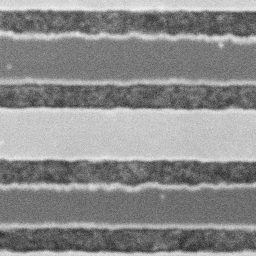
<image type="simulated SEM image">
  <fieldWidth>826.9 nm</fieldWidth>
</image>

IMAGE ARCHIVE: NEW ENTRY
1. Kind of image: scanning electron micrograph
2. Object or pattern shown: lines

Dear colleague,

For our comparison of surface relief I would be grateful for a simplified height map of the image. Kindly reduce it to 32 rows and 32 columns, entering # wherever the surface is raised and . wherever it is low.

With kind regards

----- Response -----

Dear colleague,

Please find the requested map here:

################################
................................
................................
................................
#####################.##....#...
################################
################################
################################
################################
################################
...............#...........##...
................................
................................
.....#.............#............
################################
################################
################################
################################
################################
################################
................................
................................
................................
################################
################################
################################
################################
################################
................................
................................
................................
#....#..#.......................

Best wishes